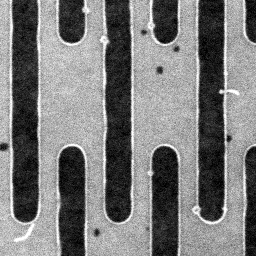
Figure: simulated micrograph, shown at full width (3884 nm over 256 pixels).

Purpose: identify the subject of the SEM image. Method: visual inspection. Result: groups of lines, slits or small figures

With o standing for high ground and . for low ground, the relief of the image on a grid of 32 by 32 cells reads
.oooo..oooo..ooo...ooo...ooo..oo
.oooo..oooo..ooo...ooo...ooo...o
.oooo..oooo..ooo...ooo...ooo...o
..ooo..oooo..ooo...ooo...ooo...o
.oooo..oooo..oooo..ooo...ooo...o
.oooo........oooo...o....ooo....
.oooo........oooo........ooo....
.oooo........oooo........ooo....
.oooo........oooo........ooo....
.oooo........oooo........ooo....
.oooo........oooo........ooo....
.oooo........oooo........ooo....
.oooo........oooo........ooo....
.oooo........oooo........ooo....
.oooo........oooo........ooo....
.oooo........oooo........ooo....
.oooo........oooo........ooo....
.oooo........oooo........ooo....
.oooo...oo...oooo..ooo...ooo...o
..ooo..oooo..oooo..ooo...ooo...o
..ooo..oooo..oooo..ooo...ooo...o
.oooo..oooo..oooo..ooo...ooo...o
.oooo..oooo..oooo..ooo...ooo...o
..ooo..oooo..oooo..ooo...ooo...o
..ooo..oooo..oooo..ooo...ooo...o
..ooo..oooo..oooo..ooo...ooo...o
..ooo..oooo..oooo..ooo..oooo...o
..oo...oooo...oo...ooo...ooo..oo
.......oooo........ooo........oo
.......oooo........ooo........oo
.......oooo........ooo.........o
.......oooo........ooo.........o